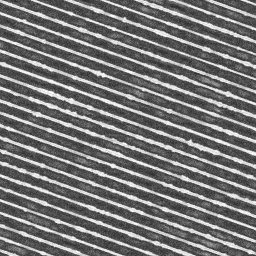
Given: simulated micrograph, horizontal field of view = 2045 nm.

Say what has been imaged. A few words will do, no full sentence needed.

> parallel lines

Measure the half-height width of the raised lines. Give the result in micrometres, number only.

0.0207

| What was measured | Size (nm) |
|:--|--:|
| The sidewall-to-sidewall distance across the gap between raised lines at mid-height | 69.6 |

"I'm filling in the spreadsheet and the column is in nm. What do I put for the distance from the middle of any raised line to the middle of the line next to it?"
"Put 93.8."